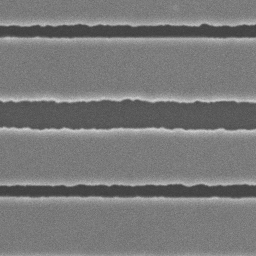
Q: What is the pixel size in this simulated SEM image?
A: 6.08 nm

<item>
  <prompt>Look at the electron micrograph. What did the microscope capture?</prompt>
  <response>lines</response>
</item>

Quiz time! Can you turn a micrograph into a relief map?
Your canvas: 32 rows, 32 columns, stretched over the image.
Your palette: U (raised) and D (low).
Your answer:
UUUUUUUUUUUUUUUUUUUUUUUUUUUUUUUU
UUUUUUUUUUUUUUUUUUUUUUUUUUUUUUUU
UUUUUUUUUUUUUUUUUUUUUUUUUUUUUUUU
DDDDDDDDDDDDDDDDDDDDDDDDDDDDDDDD
DDDDDDDDDDDDDDDDDDDDDDDDDDDDDDDD
UUUUUUUUUUUUUUUUUUUUUUUUUUUUUUUU
UUUUUUUUUUUUUUUUUUUUUUUUUUUUUUUU
UUUUUUUUUUUUUUUUUUUUUUUUUUUUUUUU
UUUUUUUUUUUUUUUUUUUUUUUUUUUUUUUU
UUUUUUUUUUUUUUUUUUUUUUUUUUUUUUUU
UUUUUUUUUUUUUUUUUUUUUUUUUUUUUUUU
UUUUUUUUUUUUUUUUUUUUUUUUUUUUUUUU
UUUUUUUUUUUUUDUDDDUUUUUUUUUUUUUU
DDDDDDDDDDDDDDDDDDDDDDDDDDDDDDDD
DDDDDDDDDDDDDDDDDDDDDDDDDDDDDDDD
DDDDDDDDDDDDDDDDDDDDDDDDDDDDDDDD
UUUUUUUUUUUUUUUUUUUUUUUUUUUUUUUU
UUUUUUUUUUUUUUUUUUUUUUUUUUUUUUUU
UUUUUUUUUUUUUUUUUUUUUUUUUUUUUUUU
UUUUUUUUUUUUUUUUUUUUUUUUUUUUUUUU
UUUUUUUUUUUUUUUUUUUUUUUUUUUUUUUU
UUUUUUUUUUUUUUUUUUUUUUUUUUUUUUUU
UUUUUUUUUUUUUUUUUUUUUUUUUUUUUUUU
DDDDDDDDDDDDDDDDDDDDDDDDDDDDDDDD
DDDDDDDDDDDDDDDDDDDDDDDDDDDDDDDD
UUUUUUUUUUUUUUUUUUUUUUUUUUUUUUUU
UUUUUUUUUUUUUUUUUUUUUUUUUUUUUUUU
UUUUUUUUUUUUUUUUUUUUUUUUUUUUUUUU
UUUUUUUUUUUUUUUUUUUUUUUUUUUUUUUU
UUUUUUUUUUUUUUUUUUUUUUUUUUUUUUUU
UUUUUUUUUUUUUUUUUUUUUUUUUUUUUUUU
UUUUUUUUUUUUUUUUUUUUUUUUUUUUUUUU